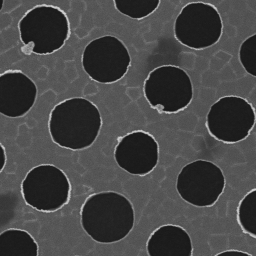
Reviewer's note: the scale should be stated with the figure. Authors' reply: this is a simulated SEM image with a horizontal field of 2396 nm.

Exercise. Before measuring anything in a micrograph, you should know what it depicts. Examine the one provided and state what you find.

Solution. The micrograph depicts a regular array of holes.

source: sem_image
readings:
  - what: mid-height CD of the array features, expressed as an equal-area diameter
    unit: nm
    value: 430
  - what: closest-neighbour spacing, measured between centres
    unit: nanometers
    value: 644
